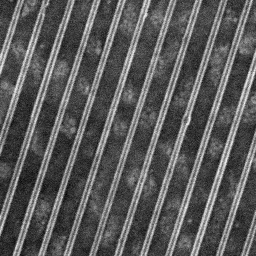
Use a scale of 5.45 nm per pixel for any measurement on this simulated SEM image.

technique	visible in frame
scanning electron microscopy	parallel lines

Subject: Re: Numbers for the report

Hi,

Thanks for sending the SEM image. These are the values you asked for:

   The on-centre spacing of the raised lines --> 132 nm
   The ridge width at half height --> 0.0266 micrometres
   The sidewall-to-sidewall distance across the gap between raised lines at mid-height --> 104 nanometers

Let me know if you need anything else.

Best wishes